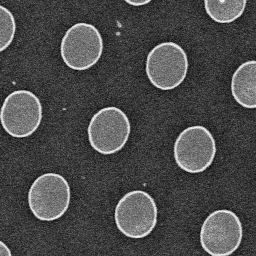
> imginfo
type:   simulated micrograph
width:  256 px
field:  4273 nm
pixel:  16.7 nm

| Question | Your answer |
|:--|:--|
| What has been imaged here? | raised bodies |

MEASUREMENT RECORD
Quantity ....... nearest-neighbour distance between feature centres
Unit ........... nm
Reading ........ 1460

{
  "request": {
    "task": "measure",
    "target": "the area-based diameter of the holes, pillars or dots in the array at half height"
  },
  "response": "0.715 µm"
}